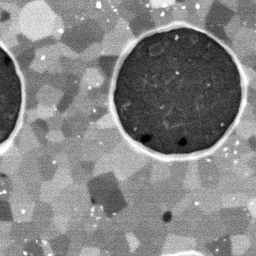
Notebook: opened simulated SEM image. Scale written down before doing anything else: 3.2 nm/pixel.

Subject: holes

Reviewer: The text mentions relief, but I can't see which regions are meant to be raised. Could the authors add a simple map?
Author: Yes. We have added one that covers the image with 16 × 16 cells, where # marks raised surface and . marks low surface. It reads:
################
################
#########....###
.#######......##
.######........#
.######........#
.######........#
.######........#
.#######......##
#########....###
################
################
################
################
################
################